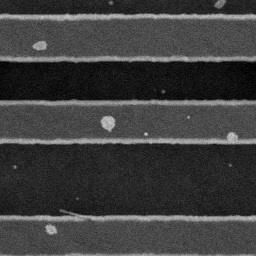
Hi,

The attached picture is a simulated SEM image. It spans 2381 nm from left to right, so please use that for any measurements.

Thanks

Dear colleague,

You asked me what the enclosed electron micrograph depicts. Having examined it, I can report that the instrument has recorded lines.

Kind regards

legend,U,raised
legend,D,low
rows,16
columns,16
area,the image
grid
DDDDDDDDDDDDDDDD
UUUUUUUUUUUUUUUU
UUUUUUUUUUUUUUUU
UUUUUUUUUUUUUUUU
DDDDDDDDDDDDDDDD
DDDDDDDDDDDDDDDD
UUUUUUUUUUUUUUUU
UUUUUUUUUUUUUUUU
UUUUUUUUUUUUUUUU
DDDDDDDDDDDDDDDD
DDDDDDDDDDDDDDDD
DDDDDDDDDDDDDDDD
DDDDDDDDDDDDDDDD
UUUDUUDUUUUUDDDU
UUUUUUUUUUUUUUUU
UUUUUUUUUUUUUUUU